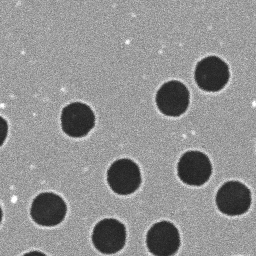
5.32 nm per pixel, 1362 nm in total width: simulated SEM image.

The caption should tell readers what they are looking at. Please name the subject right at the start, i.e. a regular array of holes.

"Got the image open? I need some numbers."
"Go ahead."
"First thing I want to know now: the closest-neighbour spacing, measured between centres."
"294 nm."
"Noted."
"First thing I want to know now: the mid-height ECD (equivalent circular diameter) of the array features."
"190 nm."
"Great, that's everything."